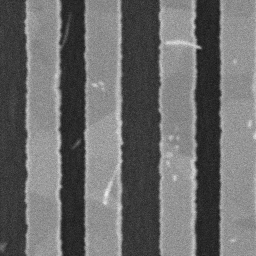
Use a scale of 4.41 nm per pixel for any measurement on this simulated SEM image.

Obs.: lines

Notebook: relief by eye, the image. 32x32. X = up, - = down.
---XXXXX---XXXX-----XXXX----XXXX
---XXXXX---XXXX-----XXXX----XXXX
---XXXXX---XXXX-----XXXX----XXXX
---XXXXX---XXXX-----XXXX----XXXX
---XXXXX---XXXX-----XXXX----XXXX
---XXXX----XXXX-----XXXXX---XXXX
---XXXX----XXXX-----XXXXX---XXXX
---XXXXX---XXXX-----XXXX----XXXX
---XXXXX---XXXX-----XXXXX---XXXX
---XXXXX---XXXX-----XXXXX---XXXX
---XXXX----XXXX-----XXXX----XXXX
---XXXXX---XXXX-----XXXX----XXXX
---XXXXX---XXXX-----XXXX----XXXX
---XXXXX---XXXX-----XXXX----XXXX
---XXXXX---XXXX-----XXXXX---XXXX
---XXXXX---XXXX-----XXXX----XXXX
---XXXX----XXXX-----XXXX----XXXX
---XXXXX---XXXX-----XXXX----XXXX
---XXXXX---XXXX-----XXXXX---XXXX
---XXXXX---XXXX-----XXXX----XXXX
---XXXXX---XXXX-----XXXX----XXXX
---XXXXX---XXXX-----XXXXX---XXXX
---XXXXX---XXXX-----XXXX----XXXX
---XXXXX---XXXX-----XXXXX---XXXX
---XXXX----XXXX-----XXXX----XXXX
---XXXXX---XXXX-----XXXX----XXXX
---XXXXX---XXXX-----XXXX----XXXX
---XXXXX---XXXX-----XXXX----XXXX
---XXXXX---XXXX-----XXXX----XXXX
---XXXXX---XXXX-----XXXX----XXXX
---XXXXX---XXXX-----XXXX----XXXX
---XXXXX---XXXX-----XXXX----XXXX